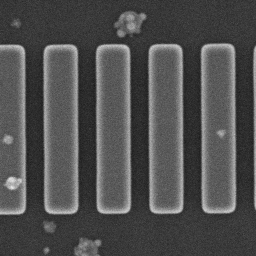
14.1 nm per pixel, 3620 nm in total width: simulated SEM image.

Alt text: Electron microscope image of groups of lines, slits or small figures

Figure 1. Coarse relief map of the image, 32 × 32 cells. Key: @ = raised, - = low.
--------------------------------
--------------------------------
--------------------------------
--------------------------------
--------------------------------
--------------------------------
@@@---@@@@--@@@@---@@@@--@@@@---
@@@---@@@@--@@@@---@@@@--@@@@---
@@@---@@@@--@@@@---@@@@--@@@@---
@@@---@@@@--@@@@---@@@@--@@@@---
@@@---@@@@--@@@@---@@@@--@@@@---
@@@---@@@@--@@@@---@@@@--@@@@---
@@@---@@@@--@@@@---@@@@--@@@@---
@@@---@@@@--@@@@---@@@@--@@@@---
@@@---@@@@--@@@@---@@@@--@@@@---
@@@---@@@@--@@@@---@@@@--@@@@---
@@@---@@@@--@@@@---@@@@--@@@@---
@@@---@@@@--@@@@---@@@@--@@@@---
@@@---@@@@--@@@@---@@@@--@@@@---
@@@---@@@@--@@@@---@@@@--@@@@---
@@@---@@@@--@@@@---@@@@--@@@@---
@@@---@@@@--@@@@---@@@@--@@@@---
@@@---@@@@--@@@@---@@@@--@@@@---
@@@---@@@@--@@@@---@@@@--@@@@---
@@@---@@@@--@@@@---@@@@--@@@@---
@@@---@@@@--@@@@---@@@@--@@@@---
@@@---@@@----@@@---@@@----@@@---
--------------------------------
--------------------------------
--------------------------------
--------------------------------
--------------------------------